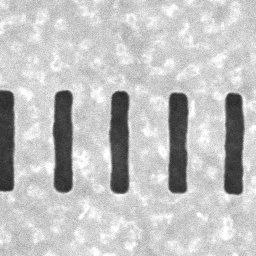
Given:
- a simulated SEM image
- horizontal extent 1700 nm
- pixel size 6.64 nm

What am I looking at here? holes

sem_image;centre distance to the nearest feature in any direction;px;56.2